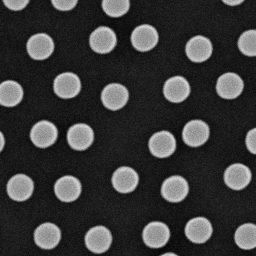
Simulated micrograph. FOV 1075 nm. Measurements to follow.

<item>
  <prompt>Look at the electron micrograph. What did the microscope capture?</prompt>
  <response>a regular array of raised bodies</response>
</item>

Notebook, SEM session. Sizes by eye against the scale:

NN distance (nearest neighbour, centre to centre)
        196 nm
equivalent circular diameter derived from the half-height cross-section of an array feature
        111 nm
